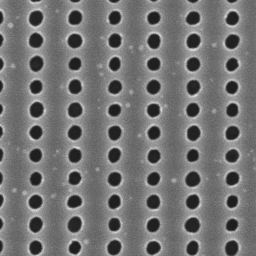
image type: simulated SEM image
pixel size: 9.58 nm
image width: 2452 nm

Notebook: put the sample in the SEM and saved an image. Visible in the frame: a regular array of holes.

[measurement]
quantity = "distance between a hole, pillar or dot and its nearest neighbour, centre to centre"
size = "217 nm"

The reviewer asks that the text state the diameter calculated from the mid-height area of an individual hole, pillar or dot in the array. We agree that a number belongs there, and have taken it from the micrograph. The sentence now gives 136 nanometres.